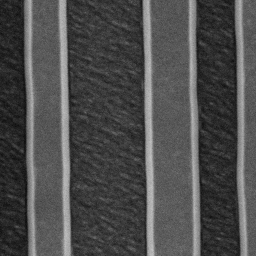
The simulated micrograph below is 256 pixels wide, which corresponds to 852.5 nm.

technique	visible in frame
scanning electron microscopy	groups of lines, slits or small figures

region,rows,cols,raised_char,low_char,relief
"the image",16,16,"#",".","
..##.....###...#
..##.....###...#
..##.....###...#
..##.....###...#
..##.....###...#
..##.....###...#
..##.....###...#
..##.....###...#
..##.....###...#
..##.....###...#
..##.....###...#
..##.....###...#
..##.....###...#
..##.....###...#
..##.....###...#
..##.....###...#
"